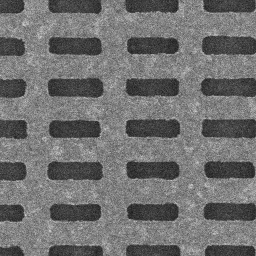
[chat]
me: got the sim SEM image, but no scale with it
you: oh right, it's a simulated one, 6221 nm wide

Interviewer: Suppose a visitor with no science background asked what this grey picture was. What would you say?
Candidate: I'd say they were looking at a regular array of holes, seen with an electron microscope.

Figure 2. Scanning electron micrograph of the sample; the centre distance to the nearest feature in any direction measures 1010 nm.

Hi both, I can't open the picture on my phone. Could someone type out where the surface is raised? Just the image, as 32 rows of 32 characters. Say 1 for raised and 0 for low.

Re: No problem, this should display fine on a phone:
00011100000001110000001110000000
00011100000011110001001111000000
11111111111111111111111111111111
11111111111111111111111111111111
11111111111111111111111111001111
00011100000001110000001110000000
00011100000001110000001110000000
11111111111111111111111111111111
11111111111111111111111111111111
11111111111111111111111111111111
00011100000001110000001110000000
00011100000001110000001110000000
11111111111111111111111111111111
11111111111111111111111111111111
11111111111111111111111111111111
00011100000011110000001110000000
00011100000001110000001110000000
11111111111111111111111111111111
11111111111111111111111111111111
11111111111111111111111111111111
00011100000001110000001111000000
00011100000001110000001111000000
00111110111011111111111111111111
11111111111111111111111111111111
11111111111111111111111111111111
01111110110011111111101111000000
00011100000001110000001110000000
00011110000011111000001111100000
11111111111111111111111111111111
11111111111111111111111111111111
11111111111111111011111111111111
00011100000001110000000111000000